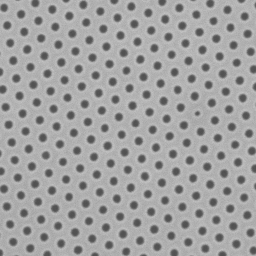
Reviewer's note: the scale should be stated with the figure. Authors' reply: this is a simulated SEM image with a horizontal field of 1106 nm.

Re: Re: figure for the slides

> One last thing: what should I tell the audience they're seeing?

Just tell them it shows a regular array of holes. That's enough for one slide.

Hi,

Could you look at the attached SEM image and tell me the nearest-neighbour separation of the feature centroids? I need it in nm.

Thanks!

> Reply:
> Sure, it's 76.5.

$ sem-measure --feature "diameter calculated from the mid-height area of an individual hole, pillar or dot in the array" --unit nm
36.5